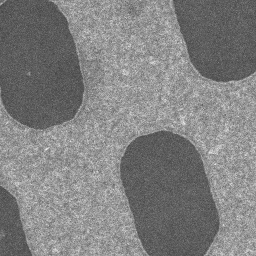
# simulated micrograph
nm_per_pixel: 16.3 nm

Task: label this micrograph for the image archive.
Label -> holes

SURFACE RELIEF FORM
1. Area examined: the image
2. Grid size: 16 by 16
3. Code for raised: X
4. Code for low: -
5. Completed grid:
----XXXXXXX-----
----XXXXXXX-----
-----XXXXXXX----
-----XXXXXXX----
-----XXXXXXX----
-----XXXXXXXXXXX
-----XXXXXXXXXXX
X---XXXXXXXXXXXX
XXXXXXXXX--XXXXX
XXXXXXXX----XXXX
XXXXXXXX-----XXX
XXXXXXXX-----XXX
-XXXXXXX-----XXX
-XXXXXXX------XX
--XXXXXXX-----XX
--XXXXXXX----XXX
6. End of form